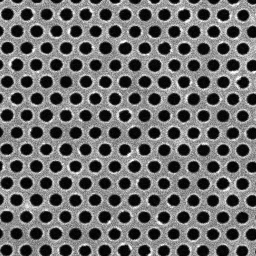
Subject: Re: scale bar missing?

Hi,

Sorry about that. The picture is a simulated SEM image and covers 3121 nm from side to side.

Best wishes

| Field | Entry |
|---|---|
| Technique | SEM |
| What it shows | a regular array of holes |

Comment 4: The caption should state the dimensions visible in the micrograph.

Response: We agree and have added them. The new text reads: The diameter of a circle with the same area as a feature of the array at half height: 153 nm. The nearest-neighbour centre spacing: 234 nm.